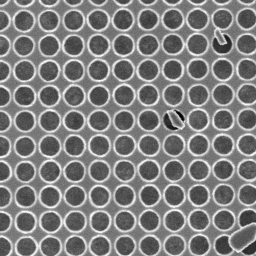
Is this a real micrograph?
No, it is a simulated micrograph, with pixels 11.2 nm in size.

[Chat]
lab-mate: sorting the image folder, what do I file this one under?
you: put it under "a regular array of holes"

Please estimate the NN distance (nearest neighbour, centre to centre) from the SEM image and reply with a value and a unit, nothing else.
274 nanometres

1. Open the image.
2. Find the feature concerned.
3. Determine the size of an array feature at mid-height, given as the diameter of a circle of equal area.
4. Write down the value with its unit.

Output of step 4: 0.22 µm